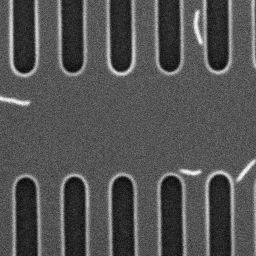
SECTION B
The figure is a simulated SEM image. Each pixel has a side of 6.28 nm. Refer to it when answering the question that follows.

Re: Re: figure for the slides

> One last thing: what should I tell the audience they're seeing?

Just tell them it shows groups of lines, slits or small figures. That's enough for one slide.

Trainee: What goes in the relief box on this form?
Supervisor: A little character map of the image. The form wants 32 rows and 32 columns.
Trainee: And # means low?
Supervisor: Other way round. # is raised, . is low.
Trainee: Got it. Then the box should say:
#...###...####...###...###...###
#....##...####...###...###...###
#....##....###...###...###...###
#....##....###...###...###...###
#....###...###...###...###...###
#....###...###...###...###...###
#....###...###...###...###...###
##...###...###...###...###...###
##..####..####..####..####..####
################################
################################
################################
################################
################################
################################
################################
################################
################################
################################
################################
################################
################################
##..####..####..####..####...###
##...###...###...###...###...###
##...###...###...###...###...###
##...###...###...###...###...###
##...###...###...###...###...###
##...###...###...###...###...###
##...###...###...###...###...###
##...###...###...###...###...###
##...###...###...###...###...###
##...###...###...###...###...###